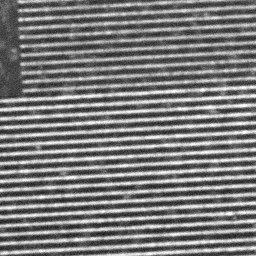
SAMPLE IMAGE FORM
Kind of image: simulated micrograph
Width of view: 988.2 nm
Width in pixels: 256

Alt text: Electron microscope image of parallel lines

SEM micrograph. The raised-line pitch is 8.91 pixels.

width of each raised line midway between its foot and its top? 7.2 nm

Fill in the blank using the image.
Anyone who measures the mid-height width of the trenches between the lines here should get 27.4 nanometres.